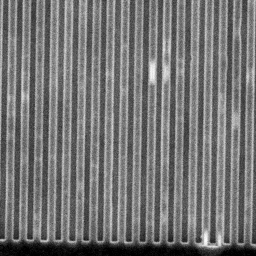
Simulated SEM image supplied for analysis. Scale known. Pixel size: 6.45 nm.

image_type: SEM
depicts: parallel lines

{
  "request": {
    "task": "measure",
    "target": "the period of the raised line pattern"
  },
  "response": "90.5 nm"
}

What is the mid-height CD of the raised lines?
49.9 nanometres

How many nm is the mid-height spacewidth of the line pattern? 39.5